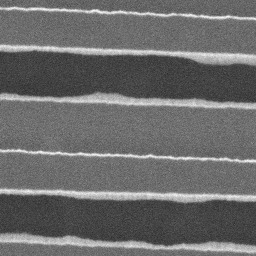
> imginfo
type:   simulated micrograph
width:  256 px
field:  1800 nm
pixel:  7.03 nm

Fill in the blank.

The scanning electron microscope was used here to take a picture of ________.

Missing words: lines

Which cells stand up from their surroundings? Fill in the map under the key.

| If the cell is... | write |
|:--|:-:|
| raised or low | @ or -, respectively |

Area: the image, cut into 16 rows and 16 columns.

@@@@@@@@@@@@@@@@
@@@@@@@@@@@@@@@@
@@@@@@@@@@@@@@@@
------------@@@@
----------------
----------------
@@@@@@@@@@@@----
@@@@@@@@@@@@@@@@
@@@@@@@@@@@@@@@@
@@@@@@@@@@@@@@@@
@@@@@@@@@@@@@@@@
@@@@@@@@@@@@@@@@
----------------
----------------
----------------
@@@@@@@@@@@@@@--